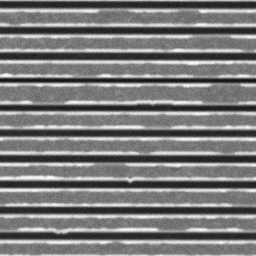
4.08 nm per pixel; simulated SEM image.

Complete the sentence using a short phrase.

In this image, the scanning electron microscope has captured parallel lines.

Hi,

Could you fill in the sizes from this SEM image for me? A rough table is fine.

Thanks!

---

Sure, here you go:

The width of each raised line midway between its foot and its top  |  0.0709 micrometres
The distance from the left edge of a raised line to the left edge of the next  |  105 nm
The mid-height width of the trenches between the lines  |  33.6 nanometres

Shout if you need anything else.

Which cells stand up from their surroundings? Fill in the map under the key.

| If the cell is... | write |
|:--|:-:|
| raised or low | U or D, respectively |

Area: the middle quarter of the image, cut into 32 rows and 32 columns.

UUUUUUUUUUUUUUUUUUUUUUUUUUUUUUUU
UUUUUUUUUUUUUUUUUUUUUUUUUUUUUUUU
UUUUUUUUUUUUUUUUUUUUUUUUUUUUUUUU
DDDDDDDDDDDDDDDDDDDDDDDDDDDDDDDD
DDDDDDDDDDDDDDDDDDDDDDDDDDDDDDDD
UUUUUUUUUUUUUUUUUUUUUUUUUUUUUUUU
UUUUUUUUUUUUUUUUUUUUUUUUUUUUUUUU
UUUUUUUUUUUUUUUUUUUUUUUUUUUUUUUU
UUUUUUUUUUUUUUUUUUUUUUUUUUUUUUUU
UUUUUUUUUUUUUUUUUUUUUUUUUUUUUUUU
DDDDDDDDDDDDDDDDDDDDDDDDDDDDDDDD
DDDDDDDDDDDDDDDDDDDDDDDDDDDDDDDD
UUUUUUUUUUUUUUUUUUUUUUUUUUUUUUUU
UUUUUUUUUUUUUUUUUUUUUUUUUUUUUUUU
UUUUUUUUUUUUUUUUUUUUUUUUUUUUUUUU
UUUUUUUUUUUUUUUUUUUUUUUUUUUUUUUU
DDDDDDDDDDDDDDDDDDDDDDDDDDDDDDDD
DDDDDDDDDDDDDDDDDDDDDDDDDDDDDDDD
DDDDDDDDDDDDDDDDDDDDDDDDDDDDDDDD
UUUUUUUUUUUUUUUUUUUUUUUUUUUUUUUU
UUUUUUUUUUUUUUUUUUUUUUUUUUUUUUUU
UUUUUUUUUUUUUUUUUUUUUUUUUUUUUUUU
UUUUUUUUUUUUUUUUUUUUUUUUUUUUUUUU
DDDDDDDDDDDDDDDDDDDDDDDDDDDDDDDD
DDDDDDDDDDDDDDDDDDDDDDDDDDDDDDDD
UUUUUUUUUUUUUUUUUUUUUUUUUUUUUUUU
UUUUUUUUUUUUUUUUUUUUUUUUUUUUUUUU
UUUUUUUUUUUUUUUUUUUUUUUUUUUUUUUU
UUUUUUUUUUUUUUUUUUUUUUUUUUUUUUUU
DDDDDDDDDDDDDDDDUDDDDDDDDDDDDDDD
DDDDDDDDDDDDDDDDDDDDDDDDDDDDDDDD
UUUUUUUUUUUUUUUUUUUUUUUUUUUUUUUU